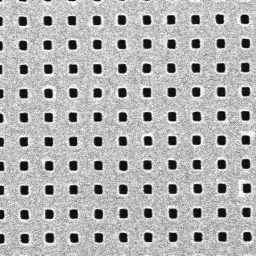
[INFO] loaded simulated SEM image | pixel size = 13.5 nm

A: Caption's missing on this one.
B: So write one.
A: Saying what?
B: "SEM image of a regular array of holes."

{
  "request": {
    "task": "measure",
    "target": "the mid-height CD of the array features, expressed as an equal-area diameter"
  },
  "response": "138 nm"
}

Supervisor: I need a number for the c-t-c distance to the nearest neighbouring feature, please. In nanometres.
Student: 323